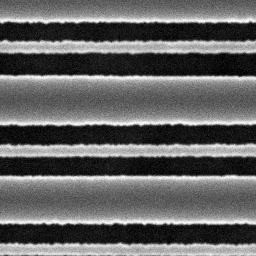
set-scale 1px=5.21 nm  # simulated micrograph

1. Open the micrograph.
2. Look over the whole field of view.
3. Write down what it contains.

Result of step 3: lines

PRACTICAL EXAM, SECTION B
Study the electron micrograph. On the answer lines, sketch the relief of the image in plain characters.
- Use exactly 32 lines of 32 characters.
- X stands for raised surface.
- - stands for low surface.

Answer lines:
XXXXXXXXXXXXXXXXXXXXXXXXXXXXXXXX
XXXXXXXXXXXXXXXXXXXXXXXXXXXXXXXX
XXXXXXXXXXXXXXXXXXXXXXXXXXXXXXXX
--------------------------------
--------------------------------
XXXXXXXXXXXXXXXXXXXXXXXXXXXXXXXX
XXXXXXXX-XX-XX-XX--XXXX--XXXXXXX
--------------------------------
--------------------------------
X-------------------------------
XXXXXXXXXXXXXXXXXXXXXXXXXXXXXXXX
XXXXXXXXXXXXXXXXXXXXXXXXXXXXXXXX
XXXXXXXXXXXXXXXXXXXXXXXXXXXXXXXX
XXXXXXXXXXXXXXXXXXXXXXXXXXXXXXXX
XXXXXXXXXXXXXXXXXXXXXXXXXXXXXXXX
XXXXXXXXXXXXXXXXXXXXXX-XXXXXXXXX
--------------------------------
--------------------------------
XXXXXXXXXXXXXXXXXXXXXXXXXXXXXXXX
XXXXX-XXX-XXXXXXX--XXX--X-XXX-XX
--------------------------------
--------------------------------
XXXXXXXXXXXXXXXXXXXXXXXXXXXXXXXX
XXXXXXXXXXXXXXXXXXXXXXXXXXXXXXXX
XXXXXXXXXXXXXXXXXXXXXXXXXXXXXXXX
XXXXXXXXXXXXXXXXXXXXXXXXXXXXXXXX
XXXXXXXXXXXXXXXXXXXXXXXXXXXXXXXX
XXXXXXXXXXXXXXXXXXXXXXXXXXXXXXXX
--------------------------------
--------------------------------
--------------------------------
XXXXXXXXXXXXXXXXXXXXXXXXXXXXXXXX